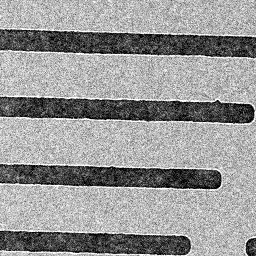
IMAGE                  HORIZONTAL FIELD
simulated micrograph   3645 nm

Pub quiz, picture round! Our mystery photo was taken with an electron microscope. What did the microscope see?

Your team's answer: one or a few lines or trenches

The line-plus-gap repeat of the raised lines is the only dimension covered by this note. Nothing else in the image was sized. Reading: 66.8 pixels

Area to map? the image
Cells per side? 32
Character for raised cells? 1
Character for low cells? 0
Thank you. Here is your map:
11111111111111111111111111111111
11111111111111111111111111111111
11111111111111111111111111111111
11111111111111111111111111111111
00000000000000000000000000000010
00000000000000000000000000000000
11100000000000000000000000000000
11111111111111111111111111111111
11111111111111111111111111111111
11111111111111111111111111111111
11111111111111111111111111111111
11111111111111111111111111111111
00000000000000000010111111111111
00000000000000000000000000000000
00000000000000000000000000000000
11111111111111111111111111111011
11111111111111111111111111111111
11111111111111111111111111111111
11111111111111111111111111111111
11111111111111111111111111111111
00001111111111111111111111111111
00000000000000000000000000011111
00000000000000000000000000001111
11111111111111111110000000011111
11111111111111111111111111111111
11111111111111111111111111111111
11111111111111111111111111111111
11111111111111111111111111111111
11111111111111111111111111111111
00000000000000000000000111111111
00000000000000000000000011111110
11110000000000000000000011111110